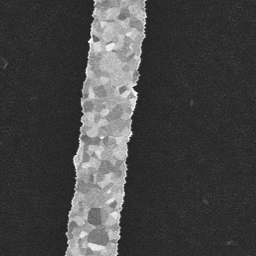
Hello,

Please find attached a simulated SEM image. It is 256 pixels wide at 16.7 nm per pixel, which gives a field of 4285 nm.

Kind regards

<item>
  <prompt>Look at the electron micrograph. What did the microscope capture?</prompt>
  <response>one or a few lines or trenches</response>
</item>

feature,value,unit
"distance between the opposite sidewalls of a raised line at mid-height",840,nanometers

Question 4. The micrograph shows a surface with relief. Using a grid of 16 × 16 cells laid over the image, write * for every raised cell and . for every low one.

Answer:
......***.......
......***.......
......***.......
......***.......
.....****.......
.....***........
.....***........
.....***........
.....***........
.....***........
.....***........
.....***........
.....***........
....***.........
....***.........
....***.........